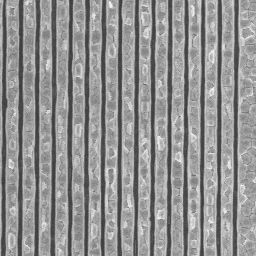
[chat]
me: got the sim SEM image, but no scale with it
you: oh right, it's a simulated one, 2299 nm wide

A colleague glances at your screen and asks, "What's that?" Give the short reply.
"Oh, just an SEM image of parallel lines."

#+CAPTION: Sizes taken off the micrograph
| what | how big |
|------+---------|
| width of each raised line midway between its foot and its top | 0.103 micrometres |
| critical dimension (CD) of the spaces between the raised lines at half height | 47.1 nm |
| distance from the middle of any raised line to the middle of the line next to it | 16.5 px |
